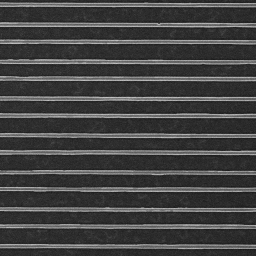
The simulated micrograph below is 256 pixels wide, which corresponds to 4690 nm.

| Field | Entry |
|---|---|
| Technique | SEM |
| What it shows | parallel lines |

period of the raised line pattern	341	nanometers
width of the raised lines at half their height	61.8	nm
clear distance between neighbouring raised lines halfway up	298	nanometres